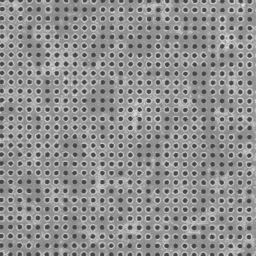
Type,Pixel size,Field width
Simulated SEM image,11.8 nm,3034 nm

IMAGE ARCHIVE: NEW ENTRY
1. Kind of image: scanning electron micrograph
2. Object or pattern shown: a regular array of holes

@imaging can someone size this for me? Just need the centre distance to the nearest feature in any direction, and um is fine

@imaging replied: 0.106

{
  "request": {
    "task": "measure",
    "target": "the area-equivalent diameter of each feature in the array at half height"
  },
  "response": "56.7 nanometers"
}